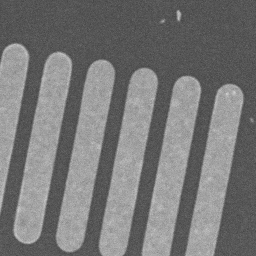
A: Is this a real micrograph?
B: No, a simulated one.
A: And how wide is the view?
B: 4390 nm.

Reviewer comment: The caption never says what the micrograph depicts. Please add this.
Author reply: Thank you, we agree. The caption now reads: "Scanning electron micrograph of groups of lines, slits or small figures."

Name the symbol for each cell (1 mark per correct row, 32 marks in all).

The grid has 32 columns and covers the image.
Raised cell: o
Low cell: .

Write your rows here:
................................
................................
................................
................................
................................
................................
.oo.............................
ooo...ooo.......................
ooo...ooo..ooo..................
ooo..oooo..ooo...oo.............
ooo..oooo..ooo..oooo..ooo.......
ooo..ooo..oooo..ooo...ooo..ooo..
ooo..ooo..oooo..ooo..oooo..ooo..
oo...ooo..oooo..ooo..oooo..ooo..
oo..oooo..ooo..oooo..ooo...ooo..
oo..oooo..ooo..oooo..ooo..oooo..
oo..ooo...ooo..oooo..ooo..oooo..
oo..ooo..oooo..ooo..oooo..ooo...
oo..ooo..oooo..ooo..oooo..ooo...
o..oooo..ooo...ooo..oooo..ooo...
o..oooo..ooo..oooo..ooo..oooo...
o..oooo..ooo..oooo..ooo..oooo...
o..ooo..oooo..ooo...ooo..oooo...
...ooo..oooo..ooo..oooo..ooo....
...ooo..ooo...ooo..oooo..ooo....
..oooo..ooo..oooo..ooo..oooo....
..ooo...ooo..oooo..ooo..oooo....
..ooo..oooo..ooo...ooo..oooo....
..ooo..oooo..ooo..oooo..ooo.....
..ooo..oooo..ooo..oooo..ooo.....
.......ooo..oooo..ooo..oooo.....
.............ooo..ooo..oooo.....